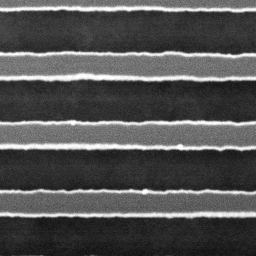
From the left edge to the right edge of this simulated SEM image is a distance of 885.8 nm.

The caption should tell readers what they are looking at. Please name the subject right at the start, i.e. lines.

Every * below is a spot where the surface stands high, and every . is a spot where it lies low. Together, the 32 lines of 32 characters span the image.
********************************
................................
................................
................................
................................
................................
................................
********************************
********************************
********************************
................................
................................
................................
................................
................................
********************************
********************************
********************************
...*.......*...*.***************
................................
................................
................................
................................
................................
********************************
********************************
********************************
................................
................................
................................
................................
................................